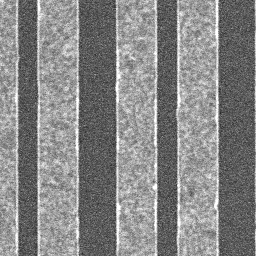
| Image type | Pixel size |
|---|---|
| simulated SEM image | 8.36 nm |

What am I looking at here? one or a few lines or trenches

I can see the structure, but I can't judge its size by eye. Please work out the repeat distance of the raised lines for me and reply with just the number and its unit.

584 nm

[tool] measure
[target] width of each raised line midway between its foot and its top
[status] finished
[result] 327 nanometres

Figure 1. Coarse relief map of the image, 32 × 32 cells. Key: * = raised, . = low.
**...*****.....****...*****.....
**...*****.....****...*****.....
**...*****.....****...*****.....
**...*****.....****...*****.....
**...*****.....****...*****.....
**...*****.....*****..*****.....
**...*****.....*****..*****.....
**...*****.....*****..*****.....
**...*****.....*****..*****.....
**...*****.....*****..*****.....
**...*****.....****...*****.....
**...*****.....****...*****.....
**...*****.....****...*****.....
**...*****.....****...*****.....
**...*****.....****...*****.....
**...*****.....****...*****.....
**...*****.....****...*****.....
**...*****.....****...*****.....
**...*****.....*****..*****.....
**...*****.....*****..*****.....
**...*****.....*****..*****.....
**...*****.....*****..*****.....
**...*****.....****...*****.....
**...*****.....*****..*****.....
**...*****.....*****..*****.....
**...*****.....*****..*****.....
**...*****.....****...*****.....
**...*****.....****...*****.....
**...*****.....****...*****.....
**...*****.....****...*****.....
**...*****.....****...*****.....
**...*****.....****...*****.....